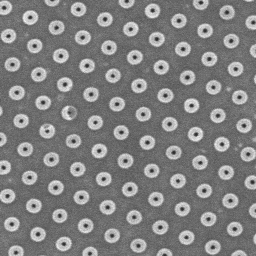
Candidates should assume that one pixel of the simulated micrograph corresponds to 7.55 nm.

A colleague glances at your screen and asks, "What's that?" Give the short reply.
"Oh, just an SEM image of a regular array of ring-shaped raised bodies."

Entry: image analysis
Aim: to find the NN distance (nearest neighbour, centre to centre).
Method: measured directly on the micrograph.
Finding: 210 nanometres